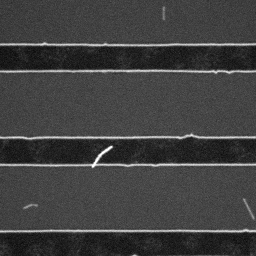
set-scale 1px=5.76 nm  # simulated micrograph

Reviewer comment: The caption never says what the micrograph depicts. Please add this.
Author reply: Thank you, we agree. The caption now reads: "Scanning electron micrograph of one or a few lines or trenches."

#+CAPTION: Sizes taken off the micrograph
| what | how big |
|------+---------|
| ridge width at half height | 162 nanometres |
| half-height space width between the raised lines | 0.379 µm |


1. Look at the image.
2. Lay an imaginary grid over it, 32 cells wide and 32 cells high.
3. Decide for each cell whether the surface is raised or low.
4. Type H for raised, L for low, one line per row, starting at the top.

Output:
LLLLLLLLLLLLLLLLLLLLLLLLLLLLLLLL
LLLLLLLLLLLLLLLLLLLLLLLLLLLLLLLL
LLLLLLLLLLLLLLLLLLLLLLLLLLLLLLLL
LLLLLLLLLLLLLLLLLLLLLLLLLLLLLLLL
LLLLLLLLLLLLLLLLLLLLLLLLLLLLLLLL
LLLLLHLLLLLLLLLLLLLLLLLLLLLLLLLL
HHHHHHHHHHHHHHHHHHHHHHHHHHHHHHHH
HHHHHHHHHHHHHHHHHHHHHHHHHHHHHHHH
HHHHHHHHHHHHHHHHHHHHHHHHHHHHHHHH
LLLLLLLLLLLLLLLLLLLLLLLLLLLLLLLL
LLLLLLLLLLLLLLLLLLLLLLLLLLLLLLLL
LLLLLLLLLLLLLLLLLLLLLLLLLLLLLLLL
LLLLLLLLLLLLLLLLLLLLLLLLLLLLLLLL
LLLLLLLLLLLLLLLLLLLLLLLLLLLLLLLL
LLLLLLLLLLLLLLLLLLLLLLLLLLLLLLLL
LLLLLLLLLLLLLLLLLLLLLLLLLLLLLLLL
LLLLLLLLLLLLLLLLLLLLLLLLLLLLLLLL
HHHHHHHHHHHHHHHHHHHHHHHHHHHHHHHH
HHHHHHHHHHHHHHHHHHHHHHHHHHHHHHHH
HHHHHHHHHHHHHHHHHHHHHHHHHHHHHHHH
HHHHHHHHHHHHHHHHHHHHHHHHHHHHHHHH
LLLLLLLLLLLLLLLLLLLLLLLLLLLLLLLL
LLLLLLLLLLLLLLLLLLLLLLLLLLLLLLLL
LLLLLLLLLLLLLLLLLLLLLLLLLLLLLLLL
LLLLLLLLLLLLLLLLLLLLLLLLLLLLLLLL
LLLLLLLLLLLLLLLLLLLLLLLLLLLLLLLL
LLLLLLLLLLLLLLLLLLLLLLLLLLLLLLLL
LLLLLLLLLLLLLLLLLLLLLLLLLLLLLLLL
LLLLLLLLLLLLLLLLLLLLLLLLLLLLLLLL
HHHHHHHHHHHHHHHHHHHHHHHHHHHHHHHH
HHHHHHHHHHHHHHHHHHHHHHHHHHHHHHHH
HHHHHHHHHHHHHHHHHHHHHHHHHHHHHHHH